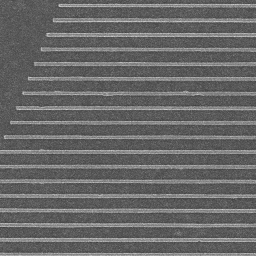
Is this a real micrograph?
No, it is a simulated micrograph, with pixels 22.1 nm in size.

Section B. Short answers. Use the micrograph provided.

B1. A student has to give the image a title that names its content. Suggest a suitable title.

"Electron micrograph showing parallel lines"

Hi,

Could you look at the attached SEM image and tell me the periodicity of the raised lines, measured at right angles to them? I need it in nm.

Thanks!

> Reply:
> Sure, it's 324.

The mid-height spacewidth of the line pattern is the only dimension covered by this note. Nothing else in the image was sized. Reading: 0.252 microns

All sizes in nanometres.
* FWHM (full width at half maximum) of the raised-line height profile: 71.9